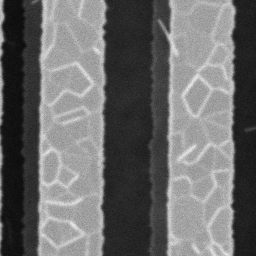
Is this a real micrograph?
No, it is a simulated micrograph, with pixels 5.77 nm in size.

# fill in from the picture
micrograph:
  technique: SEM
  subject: lines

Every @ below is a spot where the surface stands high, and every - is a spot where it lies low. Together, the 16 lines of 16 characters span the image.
---@@@@----@@@@-
---@@@-----@@@@-
---@@@-----@@@@-
---@@@-----@@@@-
---@@@-----@@@@-
---@@@-----@@@@-
---@@@-----@@@@-
--@@@@-----@@@@-
--@@@@-----@@@@-
--@@@@-----@@@@-
--@@@@-----@@@@-
--@@@@-----@@@@-
--@@@@----@@@@--
--@@@@-----@@@@-
--@@@@-----@@@--
--@@@@-----@@@@-